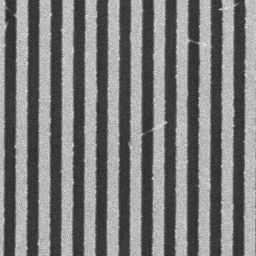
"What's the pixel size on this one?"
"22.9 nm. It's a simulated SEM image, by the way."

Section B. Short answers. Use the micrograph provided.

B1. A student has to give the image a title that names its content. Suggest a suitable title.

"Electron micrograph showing parallel lines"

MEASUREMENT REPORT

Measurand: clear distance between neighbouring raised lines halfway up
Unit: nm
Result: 215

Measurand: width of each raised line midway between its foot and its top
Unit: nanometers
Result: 292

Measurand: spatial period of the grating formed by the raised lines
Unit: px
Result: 22.9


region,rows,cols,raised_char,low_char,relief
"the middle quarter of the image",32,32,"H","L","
HHLLLHHHLLLHHHLLLHHHLLHHHLLLHHHL
HHLLLHHHLLLHHHLLLHHHLLHHHLLLHHHL
HHLLLHHHLLLHHHLLLHHHLLHHHLLLHHHL
HHLLLHHHLLLHHHLLLHHHLLHHHLLLHHHL
HHLLLHHHLLLHHHLLLHHHLLHHHLLLHHHL
HHLLLHHHLLLHHHLLLHHHLLHHHLLLHHHL
HHHLLHHHLLLHHHLLLHHHLLHHHLLLHHHL
HHHLLHHHLLLHHHLLLHHHLLHHHLLLHHHL
HHHLLHHHLLLHHHLLLHHHLLHHHLLLHHHL
HHLLLHHHLLLHHHLLLHHHLLHHHLLLHHHL
HHLLLHHHLLLHHHLLLHHHLLHHHLLLHHHL
HHLLLHHHLLLHHHLLLHHLLLHHHLLLHHHL
HHLLLHHHLLLHHHLLLHHLLLHHHLLLHHHL
HHLLLHHHLLLHHHLLLHHLLLHHHLLLHHHL
HHLLLHHHLLLHHHLLLHHLLLHHHHLLHHHL
HHLLLHHHLLLHHHLLLHHLLLHHHLLLHHHL
HHLLLHHHLLLHHHLLLHHLLLHHHLLLHHHL
HHLLLHHHLLLHHHLLLHHHLLHHHLLLHHHL
HHLLLHHHLLLHHHLLLHHLLLHHHLLLHHHL
HHLLLHHHLLLHHHLLHHHLLLHHHLLLHHHL
HHLLLHHHLLLHHHLLHHHLLLHHHLLLHHHL
HHLLLHHHLLLHHHLLLHHLLLHHHLLLHHHL
HHLLLHHHLLLHHHLLLHHLLLHHHLLLHHHL
HHLLLHHHLLLHHHLLHHHLLLHHHLLLHHHL
HHLLLHHHLLLHHHLLHHHLLLHHHLLLHHHL
HHLLLHHHLLLHHHLLHHHLLLHHHLLLHHHL
HHLLLHHHLLLHHHLLHHHLLLHHHLLLHHHL
HHLLLHHHLLLHHHLLHHHLLLHHHLLLHHHL
HHLLLHHHLLLHHHLLHHHLLLHHHLLLHHHL
HHLLLHHHLLLHHHLLHHHLLLHHHLLLHHHL
HHLLLHHHLLLHHHLLHHHLLLHHHLLLHHHL
HHLLLHHHLLLHHHLLHHHLLLHHHLLLHHHL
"